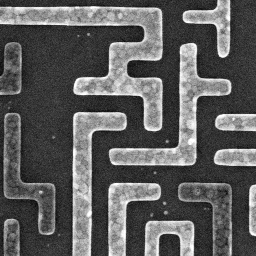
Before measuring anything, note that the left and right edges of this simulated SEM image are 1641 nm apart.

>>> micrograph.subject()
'wiring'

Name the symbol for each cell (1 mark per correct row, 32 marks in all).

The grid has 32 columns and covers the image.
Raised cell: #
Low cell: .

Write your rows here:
...........................##...
####################...######...
####################...######...
..................##.......##...
..................##.......##...
.#............######...#...##...
.##...........######...##..##...
.##...........###......##.......
###...........##.......##.......
###..........###.......##.......
###......###########..#######...
##.......###########..#######...
..................##...##.......
..................##...##.......
.#.......#######..##..##...#####
.##......#######..##..###..#####
.##......###..........###.......
.##......##...........###.......
###......##...........###.......
###......##...###########..#####
###......##...##########...#####
##.......##.....................
###......##.....................
#######..##...######..#######..#
.######..##...######..#######..#
.....##..##...##..........###..#
.....##..##...##...........##..#
.#...##..##...##...........##..#
##...##..##...##..######...##..#
##.......##...##..##..##...##...
##.......##...##..##...#...##...
##.......##...##..##...#...##...